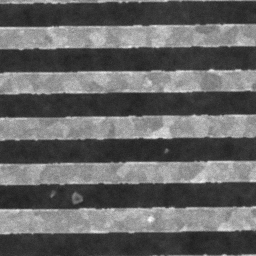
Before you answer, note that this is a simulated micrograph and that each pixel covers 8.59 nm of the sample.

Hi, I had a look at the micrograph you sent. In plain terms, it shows lines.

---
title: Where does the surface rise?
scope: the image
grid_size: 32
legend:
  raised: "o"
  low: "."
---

................................
................................
................................
oooooooooooooooooooooooooooooooo
oooooooooooooooooooooooooooooooo
oooooooooooooooooooooooooooooooo
................................
................................
................................
oooooooooooooooooooooooooooooooo
oooooooooooooooooooooooooooooooo
oooooooooooooo..................
................................
................................
........................oo..oooo
oooooooooooooooooooooooooooooooo
oooooooooooooooooooooooooooooooo
................................
................................
................................
.......ooooooooooooooooooooooooo
oooooooooooooooooooooooooooooooo
oooooooooooooooooooooooooooooooo
................................
.........o......................
................................
oooooooooooooooooooooooooooooooo
oooooooooooooooooooooooooooooooo
oooooooooooooooooooooooooooooooo
................................
................................
................................